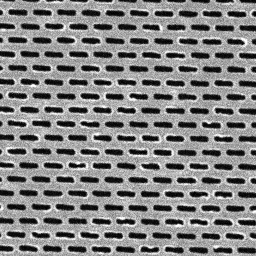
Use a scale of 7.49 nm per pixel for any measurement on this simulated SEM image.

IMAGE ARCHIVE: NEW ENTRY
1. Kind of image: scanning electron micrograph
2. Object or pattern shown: a regular array of holes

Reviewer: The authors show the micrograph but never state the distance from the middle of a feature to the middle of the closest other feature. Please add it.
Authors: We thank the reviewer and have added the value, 135 nm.